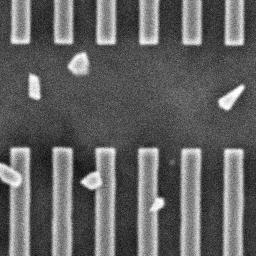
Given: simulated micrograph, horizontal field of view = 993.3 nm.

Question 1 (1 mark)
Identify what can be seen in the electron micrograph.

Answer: wiring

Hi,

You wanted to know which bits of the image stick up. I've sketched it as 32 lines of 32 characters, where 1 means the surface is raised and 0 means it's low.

00110001100011000011000110001100
00110001100011000011000110001100
00110001100011000011000110001100
00110001100011000011000110001100
00110001100011000011000110001100
00000000000000000000000000000000
00000000000000000000000000000000
00000000011000000000000000000000
00000000011000000000000000000000
00000000000000000000000000000000
00001000000000000000000000000000
00001000000000000000000000000100
00000000000000000000000000001000
00000000000000000000000000001000
00000000000000000000000000000000
00000000000000000000000000000000
00000000000000000000000000000000
00000000000000000000000000000000
00000000000000000000000000000000
01110001100011000111000110001100
01110001100011000111000110001100
11110001100011000111000110001100
11110001101111000111000110001100
01110001100111000111000110001100
01110001100011000111000110001100
01110001100011000111000110001100
01110001100011000111000110001100
01110001100011000111000110001100
01110001100011000111000110001100
01110001100011000111000110001100
01110001100011000111000110001100
01110001100011000111000110001100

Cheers